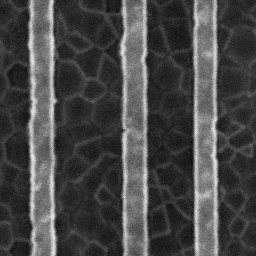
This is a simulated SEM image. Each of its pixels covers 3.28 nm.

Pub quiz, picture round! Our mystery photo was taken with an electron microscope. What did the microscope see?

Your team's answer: one or a few lines or trenches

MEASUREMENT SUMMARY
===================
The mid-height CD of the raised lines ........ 68.5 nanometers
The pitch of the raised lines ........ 268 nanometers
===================